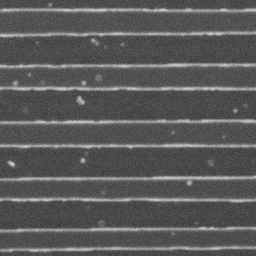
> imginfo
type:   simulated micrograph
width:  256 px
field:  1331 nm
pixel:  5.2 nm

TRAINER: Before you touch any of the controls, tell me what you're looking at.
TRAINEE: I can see lines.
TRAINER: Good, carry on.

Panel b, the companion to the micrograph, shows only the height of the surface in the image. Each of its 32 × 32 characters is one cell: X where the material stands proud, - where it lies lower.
--------------------------------
XXXXXXXXXXXXXXXXXXXXXXXXXXXXXXXX
XXXXXXXXXXXXXXXXXXXXXXXXXXXXXXXX
XXXXXXXXXXXXXXXXXXXXXXXXXXXXXXXX
XXX-----------------------------
--------------------------------
--------------------------------
--------------------------------
XXXXXXXXXXXXXXXXXXXXXXXXXXXXXXXX
XXXXXXXXXXXXXXXXXXXXXXXXXXXXXXXX
XXXXXXXXXXXXXXXXXXXXXXXXXXXXXXXX
--------------------------------
--------------------------------
--------------------------------
--------------------------------
XXXXXXXXXXXXXXXXXXXXXXXXXXXXXXXX
XXXXXXXXXXXXXXXXXXXXXXXXXXXXXXXX
XXXXXXXXXXXXXXXXXXXXXXXXXXXXXXXX
--------------------------------
--------------------------------
--------------------------------
--------------------------------
XXXXXXXXXXXXXXXXXXXXXXXXXXXXXXXX
XXXXXXXXXXXXXXXXXXXXXXXXXXXXXXXX
XXXXXXXXXXXXXXXXXXXXXXXXXXXXXXXX
--------------------------------
--------------------------------
--------------------------------
-------------------------X--XXXX
XXXXXXXXXXXXXXXXXXXXXXXXXXXXXXXX
XXXXXXXXXXXXXXXXXXXXXXXXXXXXXXXX
--------------------------------